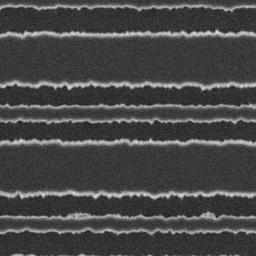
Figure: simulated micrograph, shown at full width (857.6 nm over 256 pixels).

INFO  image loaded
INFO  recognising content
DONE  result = lines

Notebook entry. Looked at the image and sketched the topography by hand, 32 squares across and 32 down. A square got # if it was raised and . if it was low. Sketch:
################################
................................
................................
................................
################################
################################
################################
################################
################################
################################
################################
................................
................................
################################
################################
................................
................................
...............#................
################################
################################
################################
################################
################################
################################
.##..........##....##.#........#
................................
................................
################################
################################
................................
................................
................................